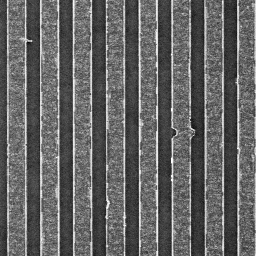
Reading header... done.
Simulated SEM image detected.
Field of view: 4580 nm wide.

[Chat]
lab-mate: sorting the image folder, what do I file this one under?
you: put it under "parallel lines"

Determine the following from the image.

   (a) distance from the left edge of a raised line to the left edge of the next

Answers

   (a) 32.9 px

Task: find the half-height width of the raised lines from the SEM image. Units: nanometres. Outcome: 331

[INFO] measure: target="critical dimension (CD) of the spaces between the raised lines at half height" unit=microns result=0.266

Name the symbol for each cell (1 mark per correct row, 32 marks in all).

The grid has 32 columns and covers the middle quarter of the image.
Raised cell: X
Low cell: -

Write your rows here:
--XXXXX----XXXX----XXXX----XXXX-
--XXXXX----XXXX----XXXX----XXXX-
--XXXXX----XXXX----XXXX----XXXX-
--XXXXX----XXXX----XXXX----XXXX-
--XXXXX----XXXX----XXXX----XXXX-
--XXXXX----XXXX----XXXX----XXXX-
--XXXXX----XXXX----XXXX----XXXXX
---XXXX----XXXX----XXXX----XXXXX
---XXXX----XXXX----XXXX----XXXXX
---XXXX----XXXX----XXXX----XXXXX
---XXXX----XXXX----XXXX----XXXXX
---XXXX----XXXX----XXXX----XXXXX
---XXXX----XXXX----XXXX----XXXXX
---XXXX----XXXX----XXXX----XXXXX
---XXXX----XXXX----XXXX----XXXXX
---XXXX----XXXX----XXXX----XXXXX
---XXXX----XXXX----XXXX-----XXXX
---XXXX----XXXX----XXXX-----XXXX
---XXXX----XXXX----XXXX----XXXXX
---XXXX----XXXX----XXXX----XXXXX
---XXXX----XXXX----XXXX----XXXXX
---XXXX----XXXX----XXXX----XXXXX
---XXXX----XXXX----XXXX----XXXXX
---XXXX----XXXX----XXXX----XXXXX
---XXXX----XXXX----XXXX----XXXXX
---XXXX----XXXX----XXXX----XXXXX
---XXXX----XXXX----XXXX----XXXXX
---XXXX----XXXX----XXXX----XXXXX
---XXXX----XXXX----XXXX----XXXXX
---XXXX----XXXX----XXXX----XXXXX
---XXXX----XXXX----XXXX----XXXXX
---XXXX----XXXX----XXXX----XXXXX